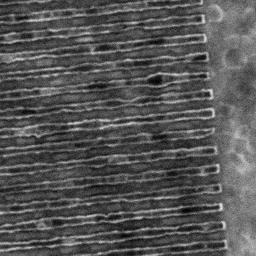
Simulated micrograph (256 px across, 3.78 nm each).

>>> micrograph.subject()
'parallel lines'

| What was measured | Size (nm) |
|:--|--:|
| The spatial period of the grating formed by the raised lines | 71.4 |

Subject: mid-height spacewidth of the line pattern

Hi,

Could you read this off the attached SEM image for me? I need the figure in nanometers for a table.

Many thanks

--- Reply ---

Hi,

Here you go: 42.8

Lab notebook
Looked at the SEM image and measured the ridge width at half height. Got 0.0287 microns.